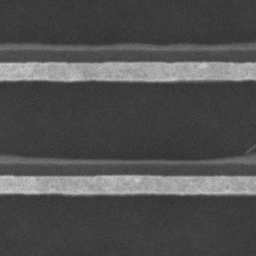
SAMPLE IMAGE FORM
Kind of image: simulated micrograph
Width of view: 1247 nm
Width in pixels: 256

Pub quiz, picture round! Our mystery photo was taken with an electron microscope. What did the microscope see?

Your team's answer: lines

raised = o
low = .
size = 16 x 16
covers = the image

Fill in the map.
................
................
................
oooooooooooooooo
oooooooooooooooo
................
................
................
................
................
oooooooooooooooo
oooooooooooooooo
................
................
................
................